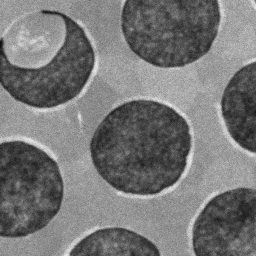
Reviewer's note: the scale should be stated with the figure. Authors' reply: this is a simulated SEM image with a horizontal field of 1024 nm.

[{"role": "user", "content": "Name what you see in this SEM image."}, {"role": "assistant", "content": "holes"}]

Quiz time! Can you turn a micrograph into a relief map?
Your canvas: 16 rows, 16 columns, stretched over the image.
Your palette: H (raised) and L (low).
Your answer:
HHHHHHHHLLLLLLHH
HHHHLHHHLLLLLLHH
HHHHLLHHLLLLLHHH
LHHLLLHHHLLLLHHH
LLLLLLHHHHHHHHHL
LLLLLHHHHHHHHHLL
HHLLHHHHLLHHHHLL
HHHHHHLLLLLLHHLL
HHHHHHLLLLLLHHLL
LLLHHHLLLLLLHHHH
LLLLHHLLLLLLHHHH
LLLLHHHLLLLHHHHH
LLLLHHHHHHHHHLLL
LLLHHHHHHHHHLLLL
LLHHHHLLHHHHLLLL
HHHHHLLLLLHHLLLL